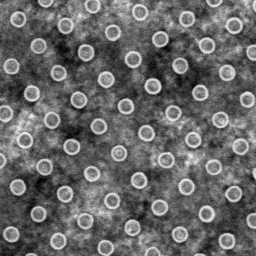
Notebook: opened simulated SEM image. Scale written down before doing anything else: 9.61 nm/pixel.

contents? a regular array of raised bodies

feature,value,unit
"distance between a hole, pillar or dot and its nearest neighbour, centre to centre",321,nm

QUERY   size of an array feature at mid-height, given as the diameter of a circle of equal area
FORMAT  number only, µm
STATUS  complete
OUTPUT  0.143